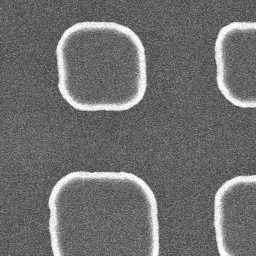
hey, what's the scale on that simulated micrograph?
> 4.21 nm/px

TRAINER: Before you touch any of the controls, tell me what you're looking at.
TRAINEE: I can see raised bodies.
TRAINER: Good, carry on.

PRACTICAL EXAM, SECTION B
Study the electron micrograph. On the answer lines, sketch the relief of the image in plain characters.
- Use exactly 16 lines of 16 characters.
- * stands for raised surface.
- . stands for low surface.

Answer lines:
................
................
....*****.....**
....*****.....**
....*****.....**
....*****.....**
.....***.......*
................
................
................
................
....*****.....**
...*******....**
...*******....**
...*******....**
...*******....**